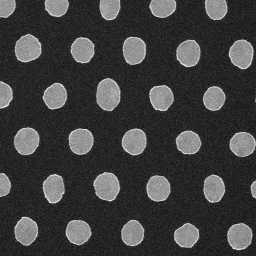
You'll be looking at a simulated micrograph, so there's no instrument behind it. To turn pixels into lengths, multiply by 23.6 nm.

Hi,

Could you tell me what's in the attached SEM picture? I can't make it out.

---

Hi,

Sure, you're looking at a regular array of raised bodies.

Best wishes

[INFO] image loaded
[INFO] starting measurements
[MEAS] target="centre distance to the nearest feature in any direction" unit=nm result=1220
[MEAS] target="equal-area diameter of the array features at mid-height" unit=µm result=0.582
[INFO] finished